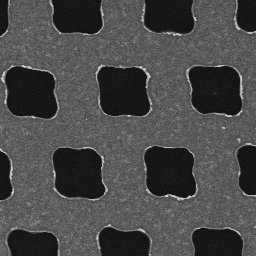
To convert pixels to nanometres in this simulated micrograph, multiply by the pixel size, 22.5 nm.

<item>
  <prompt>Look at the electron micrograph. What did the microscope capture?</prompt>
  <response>holes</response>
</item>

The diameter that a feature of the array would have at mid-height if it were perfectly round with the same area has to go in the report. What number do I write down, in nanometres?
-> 1200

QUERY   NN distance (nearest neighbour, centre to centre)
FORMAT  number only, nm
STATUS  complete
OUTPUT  2070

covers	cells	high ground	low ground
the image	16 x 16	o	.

.oo...ooo...ooo.
ooo...ooo...ooo.
oooooooooooooooo
oooooooooooooooo
o..ooo...ooo...o
...ooo...ooo...o
....oo...ooo...o
oooooooooooooooo
oooooooooooooooo
oooo..ooo...ooo.
.oo...ooo...ooo.
.ooo..ooo...ooo.
oooooooooooooooo
oooooooooooooooo
o.oooo...ooo...o
o...oo...ooo...o